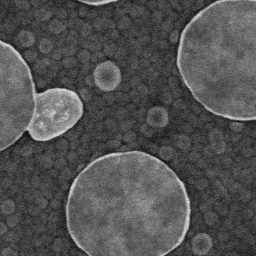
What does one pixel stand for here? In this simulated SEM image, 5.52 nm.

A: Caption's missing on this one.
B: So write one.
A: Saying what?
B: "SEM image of raised bodies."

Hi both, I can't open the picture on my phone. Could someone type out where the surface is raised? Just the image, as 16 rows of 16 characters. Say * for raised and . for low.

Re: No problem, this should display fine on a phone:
.............***
............****
...........*****
*..........*****
**....*....*****
**..........****
*****........***
*****...........
*.*.............
........*.......
.....******.....
.....******.....
....********....
....********....
....********....
.....******.....